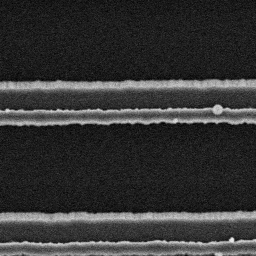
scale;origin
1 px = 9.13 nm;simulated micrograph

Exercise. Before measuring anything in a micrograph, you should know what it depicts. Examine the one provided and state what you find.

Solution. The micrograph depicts lines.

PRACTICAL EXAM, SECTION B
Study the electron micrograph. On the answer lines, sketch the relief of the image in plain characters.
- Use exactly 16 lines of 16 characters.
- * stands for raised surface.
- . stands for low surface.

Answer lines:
................
................
................
................
................
****************
****************
****************
................
................
................
................
................
................
****************
****************